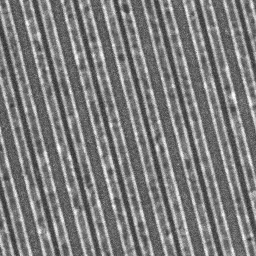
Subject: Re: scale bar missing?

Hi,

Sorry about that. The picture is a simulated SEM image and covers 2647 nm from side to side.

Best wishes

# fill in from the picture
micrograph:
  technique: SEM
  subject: parallel lines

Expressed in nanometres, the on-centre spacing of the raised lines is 204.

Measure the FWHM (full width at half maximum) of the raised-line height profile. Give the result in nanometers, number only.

91.4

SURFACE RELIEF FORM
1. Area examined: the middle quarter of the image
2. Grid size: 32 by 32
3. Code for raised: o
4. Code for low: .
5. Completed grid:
....oo..oo....oo..oo....oo..oo..
....oo..oo....oo..ooo...oo..ooo.
....oo...oo...oo...oo...ooo..oo.
o....o...oo...ooo..oo....oo..oo.
o....oo..oo....oo..oo....oo..oo.
o....oo..oo....oo..ooo...oo..ooo
o....oo...oo...oo...oo...ooo..oo
oo....oo..oo...ooo..oo....oo..oo
oo....oo..oo....oo..oo....oo..oo
oo....oo..oo....oo..ooo...oo...o
oo....oo...oo...oo...oo...ooo..o
.oo....oo..oo...ooo..oo....oo..o
.oo....oo..oo....oo..oo....oo..o
.oo....oo..oo....oo..ooo...oo...
.oo....oo...oo...oo...oo...ooo..
..oo....oo..oo...ooo..oo....oo..
..oo....oo..oo....oo..oo....oo..
..oo....oo..oo....oo..ooo...oo..
..oo....oo...oo...oo...oo...ooo.
...oo....oo..oo...ooo..oo....oo.
o..oo....oo..oo....oo..oo....oo.
o..oo....oo..ooo...oo..ooo...oo.
o..oo....oo...oo...oo...oo...ooo
oo..oo....oo..oo....oo..oo....oo
oo..oo....oo..oo....oo..oo....oo
oo..oo....oo..oo....oo..ooo...oo
oo..oo....oo...oo...oo...oo...oo
ooo..oo....oo..oo....oo..oo....o
.oo..oo....oo..oo....oo..oo....o
.oo..oo....oo..oo....oo..ooo...o
.oo..oo....oo...oo...ooo..oo...o
.ooo..oo....oo..oo....oo..oo....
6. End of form